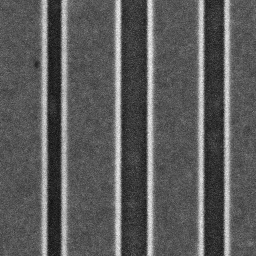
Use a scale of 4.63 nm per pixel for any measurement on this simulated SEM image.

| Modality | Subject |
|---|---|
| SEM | one or a few lines or trenches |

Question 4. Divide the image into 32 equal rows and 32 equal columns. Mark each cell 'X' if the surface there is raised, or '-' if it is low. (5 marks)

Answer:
XXXXXX--XXXXXXX----XXXXXX---XXXX
XXXXXX--XXXXXXX----XXXXXX---XXXX
XXXXXX--XXXXXXX----XXXXXX---XXXX
XXXXXX--XXXXXXX----XXXXXX---XXXX
XXXXXX--XXXXXXX----XXXXXX---XXXX
XXXXXX--XXXXXXX----XXXXXX---XXXX
XXXXXX--XXXXXXX----XXXXXX---XXXX
XXXXXX--XXXXXXX----XXXXXX---XXXX
XXXXXX--XXXXXXX----XXXXXX---XXXX
XXXXXX--XXXXXXX----XXXXXX---XXXX
XXXXXX--XXXXXXX----XXXXXX---XXXX
XXXXXX--XXXXXXX----XXXXXX---XXXX
XXXXXX--XXXXXXX----XXXXXX---XXXX
XXXXXX--XXXXXXX----XXXXXX---XXXX
XXXXXX--XXXXXXX----XXXXXX---XXXX
XXXXXX--XXXXXXX----XXXXXX---XXXX
XXXXXX--XXXXXXX----XXXXXX---XXXX
XXXXXX--XXXXXXX----XXXXXX---XXXX
XXXXXX--XXXXXXX----XXXXXX---XXXX
XXXXXX--XXXXXXX----XXXXXX---XXXX
XXXXXX--XXXXXXX----XXXXXX---XXXX
XXXXXX--XXXXXXX----XXXXXX---XXXX
XXXXXX--XXXXXXX----XXXXXX---XXXX
XXXXXX--XXXXXXX----XXXXXX---XXXX
XXXXXX--XXXXXXX----XXXXXX---XXXX
XXXXXX--XXXXXXX----XXXXXX---XXXX
XXXXXX--XXXXXXX----XXXXXX---XXXX
XXXXXX--XXXXXXX----XXXXXX---XXXX
XXXXXX--XXXXXXX----XXXXXX---XXXX
XXXXXX--XXXXXXX----XXXXXX---XXXX
XXXXXX--XXXXXXX----XXXXXX---XXXX
XXXXXX--XXXXXXX----XXXXXX---XXXX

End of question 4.